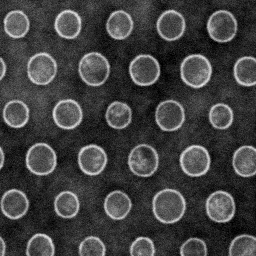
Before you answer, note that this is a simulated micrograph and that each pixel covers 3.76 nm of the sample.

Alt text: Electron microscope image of a regular array of raised bodies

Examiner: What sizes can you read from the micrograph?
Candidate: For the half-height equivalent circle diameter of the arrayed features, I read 105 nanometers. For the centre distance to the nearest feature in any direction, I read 192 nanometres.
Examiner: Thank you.